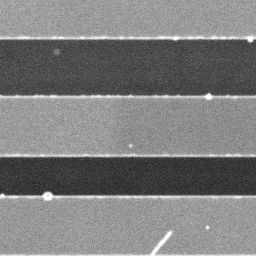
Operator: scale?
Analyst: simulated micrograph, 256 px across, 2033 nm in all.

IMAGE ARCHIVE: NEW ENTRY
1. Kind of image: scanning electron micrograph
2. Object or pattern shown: lines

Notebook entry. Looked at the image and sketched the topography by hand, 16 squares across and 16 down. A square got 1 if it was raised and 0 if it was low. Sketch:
1111111111111111
1111111111111111
0000000000000000
0000000000000000
0000000000000000
0000000000000000
1111111111111111
1111111111111111
1111111111111111
1111111111111111
0000000000000000
0000000000000000
1111111111111111
1111111111111111
1111111111111111
1111111111111111